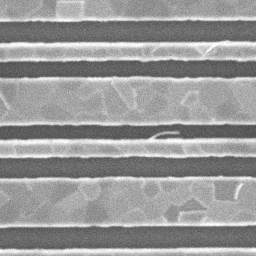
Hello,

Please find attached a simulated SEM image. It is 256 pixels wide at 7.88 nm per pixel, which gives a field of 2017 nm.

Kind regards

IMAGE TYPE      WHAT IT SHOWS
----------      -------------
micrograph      lines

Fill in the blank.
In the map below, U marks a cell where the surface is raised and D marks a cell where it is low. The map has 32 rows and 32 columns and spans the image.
UUUUUUUUUUUUUUUUUUUUUUUUUUUUUUUU
UUUUUUUUUUUUUUUUUUUUUUUUUUUUUUUU
UDUDDDUUUUDDDDDDDDDDDDDDDDDDDDDD
DDDDDDDDDDDDDDDDDDDDDDDDDDDDDDDD
DDDDDDDDDDDDDDDDDDDDDDDDDDDDDDDD
DDUUDDDDDUUUDDUUDDUUUUUUUUUUUUUU
UUUUUUUUUUUUUUUUUUUUUUUUUUUUUUUU
UUUUUUUUUUDUUUDDDDUUDDDUDDDDDUDD
DDDDDDDDDDDDDDDDDDDDDDDDDDDDDDDD
DDDDDDDDDDDDDDDDDDDDDDDDDDDDDDDD
UUUUUUUUUUUUUUUUUUUUUUUUUUUUUUUU
UUUUUUUUUUUUUUUUUUUUUUUUUUUUUUUU
UUUUUUUUUUUUUUUUUUUUUUUUUUUUUUUU
UUUUUUUUUUUUUUUUUUUUUUUUUUUUUUUU
UUUUUUUUUUUUUUUUUUUUUUUUUUUUUUUU
UUUUDDDDDUDDDUUDUUUDDDDDDDDDDDDD
DDDDDDDDDDDDDDDDDDDDDDDDDDDDDDDD
DDDDDDDDDDDDDDDDDDUUDDDDDDUUUUDD
UUUUUUUUUUUUUUUUUUUUUUUUUUUUUUUU
UUUUUUUUUUUUUUUUUDUUUUUUUUUUDUUU
DDDDDDDDDDDDDDDDDDDDDDDDDDDDDDDD
DDDDDDDDDDDDDDDDDDDDDDDDDDDDDDDD
UUUUUUUUUUUUUUUUUUUUUUUUUUUUUUUU
UUUUUUUUUUUUUUUUUUUUUUUUUUUUUUUU
UUUUUUUUUUUUUUUUUUUUUUUUUUUUUUUU
UUUUUUUUUUUUUUUUUUUUUUUUUUUUUUUU
UUUUUUUUUUUUUUUUUUUUUUUUUUUUUUUU
UUUUUUUUUUUUUUUUUUUUUUUUUUUUUUUU
DDDDDDDDDDDDDDDDDDDDDDDDDDDDDDDD
DDDDDDDDDDDDDDDDDDDDDDDDDDDDDDDD
DDDDDDDDDDDDDDDDDDDDDDDDDDDDDDDD
UUUUUUUUUUUUUUUUUUUUUUUUUUUUUUUU